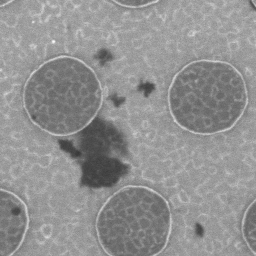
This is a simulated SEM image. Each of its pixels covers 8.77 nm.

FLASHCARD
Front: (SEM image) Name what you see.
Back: raised bodies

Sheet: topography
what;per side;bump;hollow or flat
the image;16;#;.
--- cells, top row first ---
................
................
................
................
..####.....####.
..####.....####.
..####.....####.
..####.....####.
................
................
................
................
#......###......
##....#####....#
##....#####....#
#.....####......